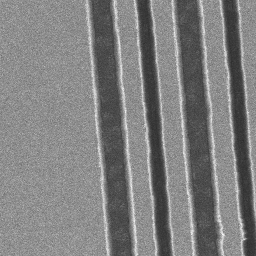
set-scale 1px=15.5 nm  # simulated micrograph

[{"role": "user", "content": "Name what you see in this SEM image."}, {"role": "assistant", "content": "parallel lines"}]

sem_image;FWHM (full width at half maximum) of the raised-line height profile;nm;389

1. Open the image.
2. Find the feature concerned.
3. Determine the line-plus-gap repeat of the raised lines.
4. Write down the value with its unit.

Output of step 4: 665 nm